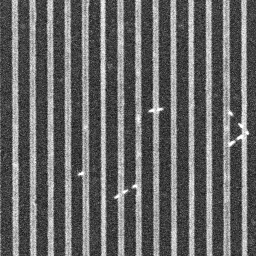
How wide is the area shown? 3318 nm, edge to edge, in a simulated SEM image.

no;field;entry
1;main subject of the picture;parallel lines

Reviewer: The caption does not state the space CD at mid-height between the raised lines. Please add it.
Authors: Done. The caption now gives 165 nm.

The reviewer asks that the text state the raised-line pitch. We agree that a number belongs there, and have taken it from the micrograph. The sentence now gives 228 nanometers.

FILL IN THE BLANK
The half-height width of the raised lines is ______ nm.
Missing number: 63.2